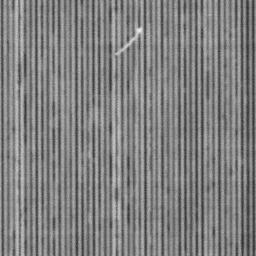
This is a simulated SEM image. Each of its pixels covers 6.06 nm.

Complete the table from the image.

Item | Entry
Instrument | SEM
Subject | parallel lines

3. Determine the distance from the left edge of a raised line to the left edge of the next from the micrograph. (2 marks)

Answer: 34.6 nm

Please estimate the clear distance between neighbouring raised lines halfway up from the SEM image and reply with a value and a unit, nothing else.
15.1 nanometres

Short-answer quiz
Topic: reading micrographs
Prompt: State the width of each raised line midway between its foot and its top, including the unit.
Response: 0.0204 microns